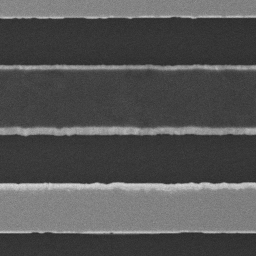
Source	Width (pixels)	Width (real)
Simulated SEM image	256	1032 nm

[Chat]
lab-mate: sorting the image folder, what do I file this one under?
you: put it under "lines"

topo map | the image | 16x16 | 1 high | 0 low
1111111111111111
0000000000000000
0000000000000000
0000000000000000
1111111111111111
1111111111111111
1111111111111111
1111111111111111
0000000000000000
0000000000000000
0000000000000000
0000000100001001
1111111111111111
1111111111111111
1111111111111111
0000000000000000